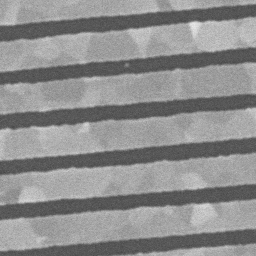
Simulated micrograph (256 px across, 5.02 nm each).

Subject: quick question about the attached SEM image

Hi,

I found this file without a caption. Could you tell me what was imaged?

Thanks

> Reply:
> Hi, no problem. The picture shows lines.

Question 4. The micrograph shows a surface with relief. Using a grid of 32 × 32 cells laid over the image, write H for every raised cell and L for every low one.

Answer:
HHHHHHHHHHHHHHHHHHHHHHHHHHHHHHHL
HHHHHHHHHHHHHHHHHHLLLLLLLLLLLLLL
HHHHHHHLLLLLLLLLLLLLLLLLLLLLLLHH
LLLLLLLLLLLLLLLLLLHHHHHHHHHHHHHH
LLLLLLLLLHHHHHHHHHHHHHHHHHHHHHHH
HHHHHHHHHHHHHHHHHHHHHHHHHHHHHHHH
HHHHHHHHHHHHHHHHHHHHHHHHHLLLLLLL
HHHHHHHHHHHHHHLLLLLLLLLLLLLLLLLL
HHHLLLLLLLLLLLLLLLLLLLLLLHHHHHHH
LLLLLLLLLLLLLLLLHHHHHHHHHHHHHHHH
LLLLHHHHHHHHHHHHHHHHHHHHHHHHHHHH
HHHHHHHHHHHHHHHHHHHHHHHHHHHHHHHH
HHHHHHHHHHHHHHHHHHLLLLLLLLLLLLLL
HHHHHHHHLLLLLLLLLLLLLLLLLLLLLLLL
LLLLLLLLLLLLLLLLLLLLLLHHHHHHHHHH
LLLLLLLLLLHHHHHHHHHHHHHHHHHHHHHH
HHHHHHHHHHHHHHHHHHHHHHHHHHHHHHHH
HHHHHHHHHHHHHHHHHHHHHHHHHHHLLLLL
HHHHHHHHHHHHHHHHHLLLLLLLLLLLLLLL
HHHHLLLLLLLLLLLLLLLLLLLLLLLLLHHH
LLLLLLLLLLLLLLLLLLLHHHHHHHHHHHHH
LLLLLLHHHHHHHHHHHHHHHHHHHHHHHHHH
HHHHHHHHHHHHHHHHHHHHHHHHHHHHHHHH
HHHHHHHHHHHHHHHHHHHHHHHHHLLLLLLL
HHHHHHHHHHHHHLLLLLLLLLLLLLLLLLLL
LLLLLLLLLLLLLLLLLLLLLLLLLLLHHHHH
LLLLLLLLLLLLHHHHHHHHHHHHHHHHHHHH
LLHHHHHHHHHHHHHHHHHHHHHHHHHHHHHH
HHHHHHHHHHHHHHHHHHHHHHHHHHHHHHHL
HHHHHHHHHHHHHHHHHHHLLLLLLLLLLLLL
HHHHHHHHHLLLLLLLLLLLLLLLLLLLLLLL
LLLLLLLLLLLLLLLLLLLLLHHHHHHHHHHH